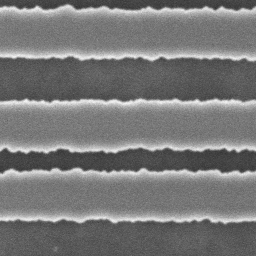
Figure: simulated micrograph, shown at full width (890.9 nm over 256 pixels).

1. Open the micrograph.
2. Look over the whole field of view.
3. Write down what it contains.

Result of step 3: lines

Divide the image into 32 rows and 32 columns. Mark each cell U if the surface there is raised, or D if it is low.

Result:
DDDDDDDDDDDDDDDDDDDDDDDDDDDDDDDD
UUUUUUUUUUUUUUUUUUUUUUUUUUUUUUUU
UUUUUUUUUUUUUUUUUUUUUUUUUUUUUUUU
UUUUUUUUUUUUUUUUUUUUUUUUUUUUUUUU
UUUUUUUUUUUUUUUUUUUUUUUUUUUUUUUU
UUUUUUUUUUUUUUUUUUUUUUUUUUUUUUUU
UUUUUUUUUUUUUUUUUUUUUUUUUUUUUUUU
DDDDDDDDDDDDDDDDDDDDDDDDDDDDDDDU
DDDDDDDDDDDDDDDDDDDDDDDDDDDDDDDD
DDDDDDDDDDDDDDDDDDDDDDDDDDDDDDDD
DDDDDDDDDDDDDDDDDDDDDDDDDDDDDDDD
DDDDDDDDDDDDDDDDDDDDDDDDDDDDDDDD
DDDDDDDDDDDDDDDDDUDDDUDDDDUDDDDD
UUUUUUUUUUUUUUUUUUUUUUUUUUUUUUUU
UUUUUUUUUUUUUUUUUUUUUUUUUUUUUUUU
UUUUUUUUUUUUUUUUUUUUUUUUUUUUUUUU
UUUUUUUUUUUUUUUUUUUUUUUUUUUUUUUU
UUUUUUUUUUUUUUUUUUUUUUUUUUUUUUUU
UUUUUUUUUUUUUUUUUDUUUUUUUUUUUUUU
DDDDDDDDDDDDDDDDDDDDDDDDDDDDDDDD
DDDDDDDDDDDDDDDDDDDDDDDDDDDDDDDD
DUUUUUUUUUUUUDUUUUUDUUUUDUUUDUDU
UUUUUUUUUUUUUUUUUUUUUUUUUUUUUUUU
UUUUUUUUUUUUUUUUUUUUUUUUUUUUUUUU
UUUUUUUUUUUUUUUUUUUUUUUUUUUUUUUU
UUUUUUUUUUUUUUUUUUUUUUUUUUUUUUUU
UUUUUUUUUUUUUUUUUUUUUUUUUUUUUUUU
UDDUDDUDDUUDDDUUUUUUUUUUDDUUUUUU
DDDDDDDDDDDDDDDDDDDDDDDDDDDDDDDD
DDDDDDDDDDDDDDDDDDDDDDDDDDDDDDDD
DDDDDDDDDDDDDDDDDDDDDDDDDDDDDDDD
DDDDDDDDDDDDDDDDDDDDDDDDDDDDDDDD